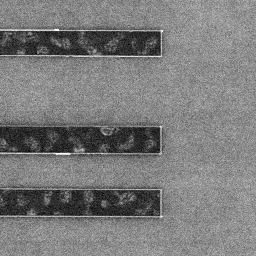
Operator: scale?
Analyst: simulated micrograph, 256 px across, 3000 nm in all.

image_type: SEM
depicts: one or a few lines or trenches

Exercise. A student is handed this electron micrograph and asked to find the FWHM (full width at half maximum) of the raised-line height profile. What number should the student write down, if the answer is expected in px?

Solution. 27.6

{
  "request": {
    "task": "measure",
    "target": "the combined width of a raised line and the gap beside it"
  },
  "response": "936 nm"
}